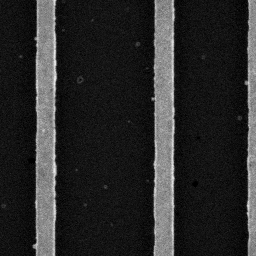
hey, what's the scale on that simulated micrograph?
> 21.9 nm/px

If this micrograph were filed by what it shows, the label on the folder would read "lines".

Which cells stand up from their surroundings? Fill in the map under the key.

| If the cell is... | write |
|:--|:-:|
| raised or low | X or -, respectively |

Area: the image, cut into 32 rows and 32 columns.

-----XX------------XXX---------X
-----XX------------XXX---------X
-----XX------------XXX---------X
-----XX------------XXX---------X
-----XX------------XXX---------X
-----XX------------XXX---------X
-----XX------------XXX---------X
-----XX------------XXX---------X
-----XX------------XXX---------X
-----XX------------XXX---------X
-----XX------------XXX---------X
-----XX------------XXX---------X
-----XX------------XXX---------X
-----XX------------XXX---------X
-----XX------------XXX---------X
-----XX------------XXX---------X
-----XX------------XXX---------X
-----XX------------XXX---------X
-----XX------------XXX---------X
-----XX------------XXX---------X
-----XX------------XXX---------X
-----XX------------XXX---------X
-----XX------------XXX---------X
-----XX------------XXX---------X
-----XX------------XXX---------X
----XXX------------XXX---------X
-----XX------------XXX---------X
-----XX------------XXX---------X
-----XX------------XXX---------X
-----XX------------XXX---------X
-----XX------------XXX---------X
-----XX------------XXX---------X